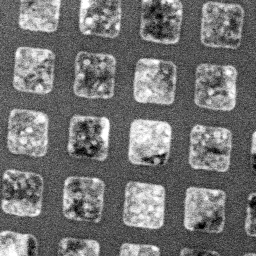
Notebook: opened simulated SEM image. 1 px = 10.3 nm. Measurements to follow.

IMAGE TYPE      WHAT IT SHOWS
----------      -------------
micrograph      a regular array of raised bodies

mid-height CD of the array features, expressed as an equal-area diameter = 431 nm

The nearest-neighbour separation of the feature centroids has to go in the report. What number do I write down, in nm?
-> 626